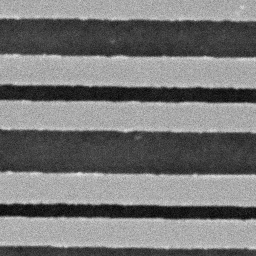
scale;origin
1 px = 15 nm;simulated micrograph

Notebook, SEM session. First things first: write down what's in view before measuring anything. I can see lines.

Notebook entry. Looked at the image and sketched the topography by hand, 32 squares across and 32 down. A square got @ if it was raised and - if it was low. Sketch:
@@@@@@@@@@@@@@@@@@@@@@@@@@@@@@@@
@@@@@@@@@@@@@@@@@@@@@@@@@@@@@@@@
---------------------@----@@@@@@
--------------------------------
--------------------------------
--------------------------------
--------------------------------
@@@@@@@@@@@@@@@@@@@@@@@@@@@@@@@@
@@@@@@@@@@@@@@@@@@@@@@@@@@@@@@@@
@@@@@@@@@@@@@@@@@@@@@@@@@@@@@@@@
-@@@@@@@@@@@@@@@@@@@@@@@@@@@@@@@
--------------------------------
--------------------------------
@@@@@@@@@@@@@@@@@@@@@@@@@@@@@@@@
@@@@@@@@@@@@@@@@@@@@@@@@@@@@@@@@
@@@@@@@@@@@@@@@@@@@@@@@@@@@@@@@@
-------------------------@-----@
--------------------------------
--------------------------------
--------------------------------
--------------------------------
--------------------------------
@@@@@@@@@@@@@@@@@@@@@@@@@@@@@@@@
@@@@@@@@@@@@@@@@@@@@@@@@@@@@@@@@
@@@@@@@@@@@@@@@@@@@@@@@@@@@@@@@@
-----------@@-@@@@@@@@@@@@@@@@@@
--------------------------------
@@@@@@@@@@@@@@@@@@@@@-----------
@@@@@@@@@@@@@@@@@@@@@@@@@@@@@@@@
@@@@@@@@@@@@@@@@@@@@@@@@@@@@@@@@
@@@@@@@@@@@@@@@@@@@@@@@@@@@@@@@@
--------------------------------